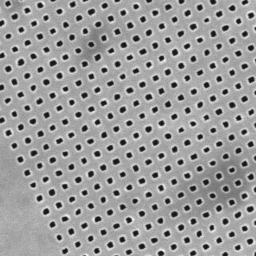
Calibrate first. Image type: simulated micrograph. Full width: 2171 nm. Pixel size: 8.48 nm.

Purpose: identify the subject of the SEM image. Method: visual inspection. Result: a regular array of holes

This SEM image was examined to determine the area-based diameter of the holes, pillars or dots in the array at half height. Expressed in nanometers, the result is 48.8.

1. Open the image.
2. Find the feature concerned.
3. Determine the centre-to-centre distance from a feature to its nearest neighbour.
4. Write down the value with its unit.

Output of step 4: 118 nm